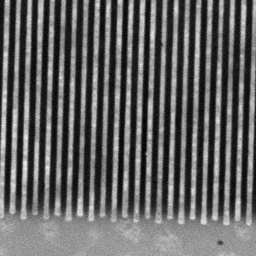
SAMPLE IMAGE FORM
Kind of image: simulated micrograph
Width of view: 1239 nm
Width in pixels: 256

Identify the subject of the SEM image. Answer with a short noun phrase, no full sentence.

parallel lines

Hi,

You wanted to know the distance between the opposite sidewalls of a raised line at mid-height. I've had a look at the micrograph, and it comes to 23.6 nanometres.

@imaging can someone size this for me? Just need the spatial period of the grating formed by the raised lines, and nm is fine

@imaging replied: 54.5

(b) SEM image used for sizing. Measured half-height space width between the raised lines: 28.4 nm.